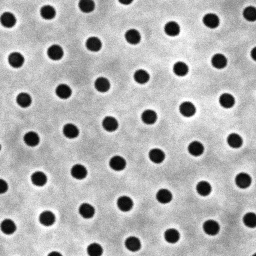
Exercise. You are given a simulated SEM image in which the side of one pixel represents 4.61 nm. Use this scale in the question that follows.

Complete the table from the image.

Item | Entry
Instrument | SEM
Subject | a regular array of holes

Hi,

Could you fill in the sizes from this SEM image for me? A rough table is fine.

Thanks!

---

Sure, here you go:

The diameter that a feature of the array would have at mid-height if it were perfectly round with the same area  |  0.0776 micrometres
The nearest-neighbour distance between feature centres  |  0.183 um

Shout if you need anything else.